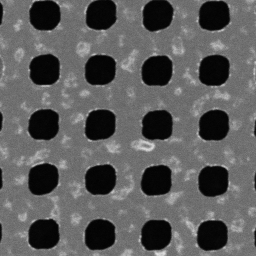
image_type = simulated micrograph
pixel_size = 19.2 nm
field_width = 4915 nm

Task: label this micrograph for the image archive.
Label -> a regular array of holes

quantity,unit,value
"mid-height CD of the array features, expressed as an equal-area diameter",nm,624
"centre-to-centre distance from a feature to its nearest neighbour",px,54.5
